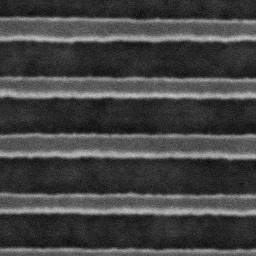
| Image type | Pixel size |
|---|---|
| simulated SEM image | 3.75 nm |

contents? lines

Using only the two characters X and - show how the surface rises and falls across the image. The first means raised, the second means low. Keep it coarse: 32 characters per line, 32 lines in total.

--------------------------------
--------------------------------
XXXXXXXXXXXXXXXXX--X------------
XXXXXXXXXXXXXXXXXXXXXXXXXXXXXXXX
XXXXXXXXXXXXXXXXXXXXXXXXXXXXXXXX
--------------------------------
--------------------------------
--------------------------------
--------------------------------
--------------------------------
XXXXXXXXXXXXXXXXXXXXXXXXXXXXXXXX
XXXXXXXXXXXXXXXXXXXXXXXXXXXXXXXX
--------------------------------
--------------------------------
--------------------------------
--------------------------------
--------------------------------
XXXXXXXXXXXXXXXXXXXXXXXXXXXXXXXX
XXXXXXXXXXXXXXXXXXXXXXXXXXXXXXXX
XX-XX--XXX----XXXXXXXXXXXXXXXXXX
--------------------------------
--------------------------------
--------------------------------
--------------------------------
XXXXXXXXXXXXXXXXXXXXXXXXXXXXXXXX
XXXXXXXXXXXXXXXXXXXXXXXXXXXXXXXX
-XXXXX-X--XXXXXXXXXXXXXXXXXXXXXX
--------------------------------
--------------------------------
--------------------------------
--------------------------------
XXXXXXXXXXXXXXXXXXXXXXXXXXXXXXXX